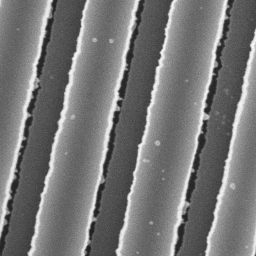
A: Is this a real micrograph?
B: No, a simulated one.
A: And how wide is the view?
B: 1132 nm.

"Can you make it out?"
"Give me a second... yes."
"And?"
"lines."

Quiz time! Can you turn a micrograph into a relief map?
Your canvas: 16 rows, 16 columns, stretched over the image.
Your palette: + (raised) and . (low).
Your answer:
+++..++++..+++..
+++..+++..++++..
+++..+++..++++..
++...+++..+++...
++..++++..+++..+
++..+++...+++..+
++..+++..++++..+
++..+++..++++..+
+...+++..+++..++
+..++++..+++..++
+..+++..++++..++
+..+++..++++..++
...+++..++++..++
..++++..+++..+++
..++++..+++..+++
..+++..++++..+++